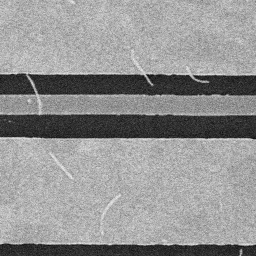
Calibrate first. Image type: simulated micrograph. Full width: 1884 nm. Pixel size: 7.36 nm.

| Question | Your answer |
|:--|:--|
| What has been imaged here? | lines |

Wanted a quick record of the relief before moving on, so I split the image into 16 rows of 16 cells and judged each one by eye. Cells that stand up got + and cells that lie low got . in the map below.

++++++++++++++++
++++++++++++++++
++++++++++++++++
++++++++++++++++
++++++++++++++++
................
................
................
................
++++++++++++++++
++++++++++++++++
++++++++++++++++
++++++++++++++++
++++++++++++++++
++++++++++++++++
................